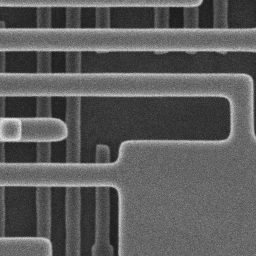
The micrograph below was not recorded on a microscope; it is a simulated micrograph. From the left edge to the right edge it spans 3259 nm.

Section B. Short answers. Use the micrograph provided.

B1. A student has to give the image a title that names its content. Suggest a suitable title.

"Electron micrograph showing wiring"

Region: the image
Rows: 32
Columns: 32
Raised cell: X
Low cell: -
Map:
XXXXXXXXXXXXXXXXXXXXXXXXX-------
--------------------------------
--------------------------------
--------------------------------
XXXXXXXXXXXXXXXXXXXXXXXXXXXXXXXX
XXXXXXXXXXXXXXXXXXXXXXXXXXXXXXXX
--------------------------------
--------------------------------
--------------------------------
XXXXXXXXXXXXXXXXXXXXXXXXXXXXXXX-
XXXXXXXXXXXXXXXXXXXXXXXXXXXXXXXX
XXXXXXXXXXXXXXXXXXXXXXXXXXXXXXXX
----------------------------XXXX
-----------------------------XXX
-----------------------------XXX
XXXXXXXX---------------------XXX
XXXXXXXX---------------------XXX
XXXXXXXX--------------------XXXX
---------------XXXXXXXXXXXXXXXXX
---------------XXXXXXXXXXXXXXXXX
X--XXX--------XXXXXXXXXXXXXXXXXX
XXXXXXXXXXXXXXXXXXXXXXXXXXXXXXXX
XXXXXXXXXXXXXXXXXXXXXXXXXXXXXXXX
--------------XXXXXXXXXXXXXXXXXX
---------------XXXXXXXXXXXXXXXXX
---------------XXXXXXXXXXXXXXXXX
---------------XXXXXXXXXXXXXXXXX
---------------XXXXXXXXXXXXXXXXX
---------------XXXXXXXXXXXXXXXXX
---------------XXXXXXXXXXXXXXXXX
XXXXXX---------XXXXXXXXXXXXXXXXX
XXXXXX---------XXXXXXXXXXXXXXXXX